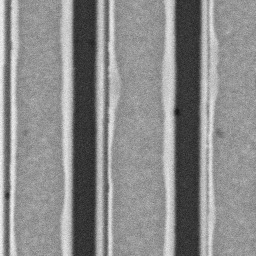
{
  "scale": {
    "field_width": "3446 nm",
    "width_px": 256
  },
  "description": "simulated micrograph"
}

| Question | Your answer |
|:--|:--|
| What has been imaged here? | lines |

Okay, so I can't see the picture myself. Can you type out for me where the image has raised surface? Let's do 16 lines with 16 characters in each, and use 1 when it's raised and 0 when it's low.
1111001111100111
1111001111100111
1111001111100111
1111001111100111
1111001111100111
1111001111100111
1111001111100111
1111001111100111
1111001111100111
1111001111100111
1111001111100111
1111001111100111
1111001111100111
1111001111100111
1111001111100111
1111001111100111